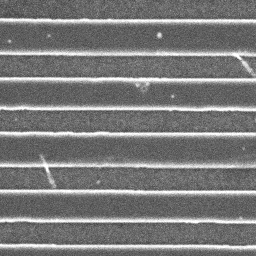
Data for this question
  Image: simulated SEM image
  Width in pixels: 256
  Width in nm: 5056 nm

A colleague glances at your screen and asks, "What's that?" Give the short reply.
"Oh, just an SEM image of lines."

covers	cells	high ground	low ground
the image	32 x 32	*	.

................................
................................
****.**...*.....................
********************************
********************************
********************************
********************************
................................
................................
................................
********************************
********************************
********************************
********************************
................................
................................
................................
********************************
********************************
********************************
********************************
................................
................................
................................
********************************
********************************
********************************
********************************
................................
................................
................................
********************************